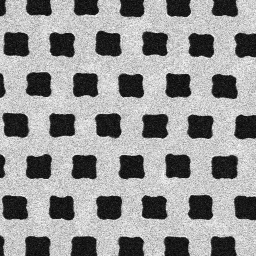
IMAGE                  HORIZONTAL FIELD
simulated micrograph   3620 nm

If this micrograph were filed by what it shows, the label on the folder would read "a regular array of holes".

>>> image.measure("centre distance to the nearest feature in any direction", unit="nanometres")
650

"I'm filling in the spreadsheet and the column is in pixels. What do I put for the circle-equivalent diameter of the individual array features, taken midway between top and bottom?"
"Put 26.5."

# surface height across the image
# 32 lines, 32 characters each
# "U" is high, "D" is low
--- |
DUUDDDUUUDDDUUUDDDUUUDDDUUUDDDUU
DUUDDDUUUDDDUUUDDDUUUDDDUUUDDDUU
UUUUUUUUUUUUUUUUUUUUUUUUUUUUUUUU
UUUUUUUUUUUUUUUUUUUUUUUUUUUUUUUU
UDDUUUDDDUUUDDDUUUDDDUUUDDUUUDDD
DDDDUUDDDUUUDDDUUUDDDUUUDDDUUDDD
UDDDUUDDDUUUDDDUUUDDDUUUDDDUUDDD
UUUUUUUUUUUUUUUUUUUUUUUUUUUUUUUU
UUUUUUUUUUUUUUUUUUUUUUUUUUUUUUUU
UUUDDDUUUDDDUUUDDDUUUDDDUUUDDUUU
UUUDDDUUUDDDUUUDDDUUUDDDUUUDDDUU
DUUDDDUUUDDDUUUDDDUUUDDDUUUDDDUU
UUUUUUUUUUUUUUUUUUUUUUUUUUUUUUUU
UUUUUUUUUUUUUUUUUUUUUUUUUUUUUUUU
DDDUUUDDDUUUDDDUUUDDDUUUDDUUUUDD
DDDDUUDDDUUUDDDUUUDDDUUUDDDUUDDD
UDDDUUDDDUUUDDDUUUDDDUUDDDDUUDDD
UUUUUUUUUUUUUUUUUUUUUUUUUUUUUUUU
UUUUUUUUUUUUUUUUUUUUUUUUUUUUUUUU
UUUUUDUUUDDDUUUDDDUUUDDUUUUDDUUU
DUUDDDUUUDDDUUUDDDUUUDDDUUDDDDUU
DUUDDDUUUDDDUUUDDDUUUDDDUUDDDDUU
UUUUUUUUUUUUUUUUUUUUUUUUUUUUUUUU
UUUUUUUUUUUUUUUUUUUUUUUUUUUUUUUU
UDUUUUUUUUUUUDDUUUUUUUUUDDUUUUDU
DDDUUUDDDUUUDDDUUUDDDUUUDDDUUDDD
DDDUUUDDDUUUDDDUUUDDDUUUDDDUUDDD
UUUUUUUUDUUUUUUUUUUUUUUUUUUUUUUU
UUUUUUUUUUUUUUUUUUUUUUUUUUUUUUUU
UUUUUUUUUUUUUUUUUUUUUUUUUUUUUUUU
UUUDDDUUUDDDUUUDDDUUUDDDUUDDDUUU
UUUDDDUUUDDDUUUDDDUUUDDDUUDDDUUU